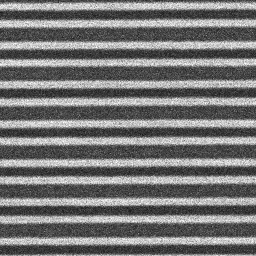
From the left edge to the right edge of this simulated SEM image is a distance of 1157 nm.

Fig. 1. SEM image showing parallel lines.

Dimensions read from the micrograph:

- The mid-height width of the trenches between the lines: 51.4 nanometres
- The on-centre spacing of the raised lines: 19.6 pixels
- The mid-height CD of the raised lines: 6.62 px